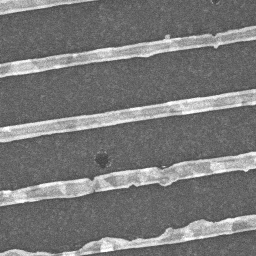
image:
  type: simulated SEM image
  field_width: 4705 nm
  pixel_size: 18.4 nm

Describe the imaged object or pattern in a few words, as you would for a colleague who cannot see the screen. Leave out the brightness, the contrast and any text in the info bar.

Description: one or a few lines or trenches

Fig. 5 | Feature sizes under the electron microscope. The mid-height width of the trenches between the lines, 952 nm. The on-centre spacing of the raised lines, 1.16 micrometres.